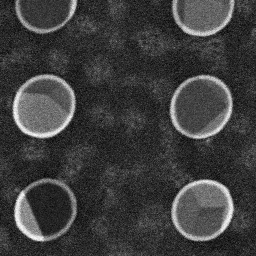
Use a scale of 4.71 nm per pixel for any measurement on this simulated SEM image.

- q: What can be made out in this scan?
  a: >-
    raised bodies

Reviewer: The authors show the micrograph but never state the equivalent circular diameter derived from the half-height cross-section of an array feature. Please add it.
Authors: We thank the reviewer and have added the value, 0.276 micrometres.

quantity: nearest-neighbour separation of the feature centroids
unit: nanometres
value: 487